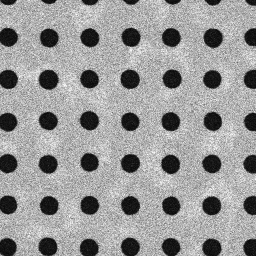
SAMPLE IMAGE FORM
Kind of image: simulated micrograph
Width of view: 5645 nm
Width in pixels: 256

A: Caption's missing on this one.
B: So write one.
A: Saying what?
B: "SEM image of a regular array of holes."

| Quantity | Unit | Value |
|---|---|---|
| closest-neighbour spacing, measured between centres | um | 0.894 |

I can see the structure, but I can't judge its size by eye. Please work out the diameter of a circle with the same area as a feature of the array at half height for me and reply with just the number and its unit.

0.424 µm